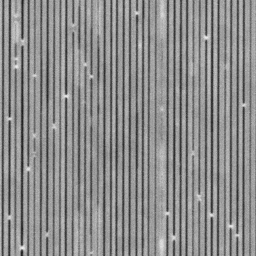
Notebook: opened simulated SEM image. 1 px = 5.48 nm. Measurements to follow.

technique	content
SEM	parallel lines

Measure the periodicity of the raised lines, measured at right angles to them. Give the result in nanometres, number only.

34.7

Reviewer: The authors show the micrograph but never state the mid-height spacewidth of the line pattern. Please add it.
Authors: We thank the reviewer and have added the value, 9.6 nm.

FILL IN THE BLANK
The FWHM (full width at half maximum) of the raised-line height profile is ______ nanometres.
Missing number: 24